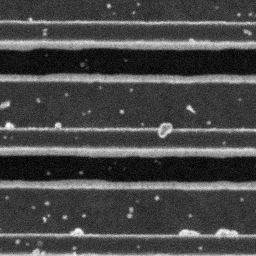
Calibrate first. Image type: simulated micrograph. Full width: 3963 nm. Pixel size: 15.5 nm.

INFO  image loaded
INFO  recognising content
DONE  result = lines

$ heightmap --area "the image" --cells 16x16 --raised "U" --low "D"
UUUUUUUUUUUUUUUU
UUUUUUUUUUUUUUUU
UUUUUUUUUUUUUUUU
DDDDDDDDDDDDDDDD
DDDDDDDDDDDDDDDD
UUUUUUUUUUUUUUUU
UUUUUUUUUUUUUUUU
UUUUUUUUUUUUUUUU
UUUUUUUUUUUUUUUU
DDDDDDDDDDDDDDDD
DDDDDDDDDDDDDDDD
DDDDDDDDDDDDDDDD
UUUUUUUUUUUUUUUU
UUUUUUUUUUUUUUUU
UUUUUUUUUUUUUUUU
UUUUUUUUUUUUUUUU